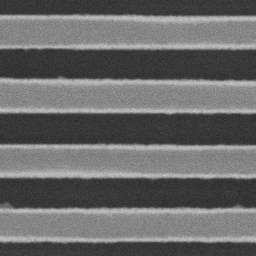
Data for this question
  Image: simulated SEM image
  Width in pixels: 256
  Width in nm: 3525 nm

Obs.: lines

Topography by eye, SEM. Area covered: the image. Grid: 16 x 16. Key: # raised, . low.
................
################
################
................
................
################
################
................
................
################
################
................
................
################
################
................